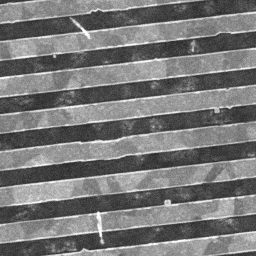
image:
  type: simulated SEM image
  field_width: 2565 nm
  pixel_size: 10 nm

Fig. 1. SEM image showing parallel lines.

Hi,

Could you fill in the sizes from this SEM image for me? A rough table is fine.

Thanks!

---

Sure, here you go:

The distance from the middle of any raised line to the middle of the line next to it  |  364 nm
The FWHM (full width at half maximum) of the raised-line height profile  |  184 nm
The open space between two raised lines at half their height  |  175 nanometres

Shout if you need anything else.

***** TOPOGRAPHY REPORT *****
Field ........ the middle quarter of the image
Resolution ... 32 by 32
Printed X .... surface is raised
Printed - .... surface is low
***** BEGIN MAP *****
----------XXXXXXXXXXXXXXXXXXXXXX
--XXXXXXXXXXXXXXXXXXXXXXXXXXXXXX
XXXXXXXXXXXXXXXXXXXXXXXXXXXXXXXX
XXXXXXXXXXXXXXXXXXXXXXXXX-------
XXXXXXXXXXXXXXXX----------------
XXXXXXXX------------------------
--------------------------------
------------------------------XX
---------------------XXXXXXXXXXX
------------XXXXXXXXXXXXXXXXXXXX
----XXXXXXXXXXXXXXXXXXXXXXXXXXXX
XXXXXXXXXXXXXXXXXXXXXXXXXXXXXXXX
XXXXXXXXXXXXXXXXXXXXXXXXX-------
XXXXXXXXXXXXXXXX----------------
XXXXXXXX------------------------
--------------------------------
-------------------------------X
----------------------XXXXXXXXXX
---------------XXXXXXXXXXXXXXXXX
--------XXXXXXXXXXXXXXXXXXXXXXXX
XXXXXXXXXXXXXXXXXXXXXXXXXXXXXXXX
XXXXXXXXXXXXXXXXXXXXXXXXXXX-----
XXXXXXXXXXXXXXXXXX--------------
XXXXXXXXXXXXXX------------------
X-------------------------------
--------------------------------
-----------------------XXXXXXXXX
--------------XXXXXXXXXXXXXXXXXX
------XXXXXXXXXXXXXXXXXXXXXXXXXX
XXXXXXXXXXXXXXXXXXXXXXXXXXXXXXXX
XXXXXXXXXXXXXXXXXXXXXXXXXXXXX---
XXXXXXXXXXXXXXXXXXXX------------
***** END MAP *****